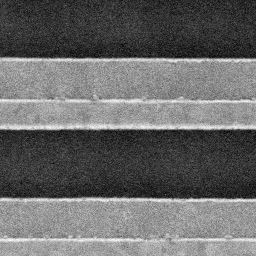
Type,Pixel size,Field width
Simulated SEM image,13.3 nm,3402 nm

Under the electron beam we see lines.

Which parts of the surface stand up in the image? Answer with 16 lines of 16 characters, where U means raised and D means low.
DDDDDDDDDDDDDDDD
DDDDDDDDDDDDDDDD
DDDDDDDDDDDDDDDD
DDDDDDDDDDDDDDDD
UUUUUUUUUUUUUUUU
UUUUUUUUUUUUUUUU
UUUUUUUUUUUUUUUU
UUUUUUUUUUUUUUUU
DDDDDDDDDDDDDDDD
DDDDDDDDDDDDDDDD
DDDDDDDDDDDDDDDD
DDDDDDDDDDDDDDDD
DDDDDDDDDDDDDDDD
UUUUUUUUUUUUUUUU
UUUUUUUUUUUUUUUU
UUUUUUUUUUUUUUUU